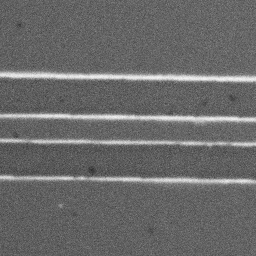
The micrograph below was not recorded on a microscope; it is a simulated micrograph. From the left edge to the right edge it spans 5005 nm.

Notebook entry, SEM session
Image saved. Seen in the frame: lines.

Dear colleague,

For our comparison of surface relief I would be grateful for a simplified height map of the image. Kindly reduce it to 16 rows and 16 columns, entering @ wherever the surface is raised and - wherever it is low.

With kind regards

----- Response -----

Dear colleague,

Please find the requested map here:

@@@@@@@@@@@@@@@@
@@@@@@@@@@@@@@@@
@@@@@@@@@@@@@@@@
@@@@@@@@@@@@@@@@
@@@@@@@@@@@@@@@@
----------------
----------------
@@@@@@@@@@@@@@@@
@@@@@@@@@@@@@@@@
----------------
----------------
@@@@@@@@@@@@@@@@
@@@@@@@@@@@@@@@@
@@@@@@@@@@@@@@@@
@@@@@@@@@@@@@@@@
@@@@@@@@@@@@@@@@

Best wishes